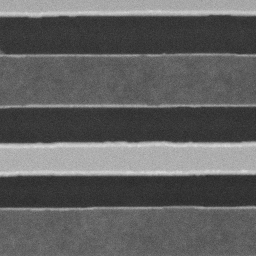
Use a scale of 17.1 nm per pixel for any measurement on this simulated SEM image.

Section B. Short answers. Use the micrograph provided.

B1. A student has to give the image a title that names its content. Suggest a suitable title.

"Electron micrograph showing lines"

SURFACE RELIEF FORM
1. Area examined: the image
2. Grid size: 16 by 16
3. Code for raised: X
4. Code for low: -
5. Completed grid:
XXXXXXXXXXXXXXXX
----------------
----------------
XXXXXXXXXXXXXXXX
XXXXXXXXXXXXXXXX
XXXXXXXXXXXXXXXX
XXXXXXXXXXXXXXXX
----------------
----------------
XXXXXXXXXXXXXXXX
XXXXXXXXXXXXXXXX
----------------
----------------
XXXXXXXXXXXXXXXX
XXXXXXXXXXXXXXXX
XXXXXXXXXXXXXXXX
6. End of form